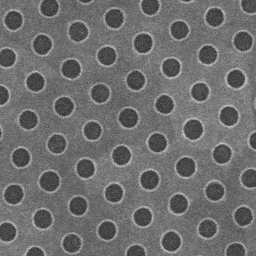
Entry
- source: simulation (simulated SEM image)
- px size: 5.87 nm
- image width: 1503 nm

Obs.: a regular array of holes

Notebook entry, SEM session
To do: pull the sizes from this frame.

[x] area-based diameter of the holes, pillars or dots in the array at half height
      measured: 118 nm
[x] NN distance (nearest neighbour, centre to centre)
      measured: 0.22 µm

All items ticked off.